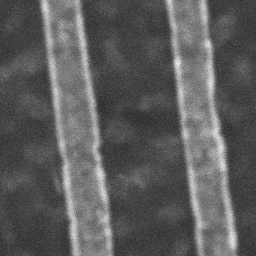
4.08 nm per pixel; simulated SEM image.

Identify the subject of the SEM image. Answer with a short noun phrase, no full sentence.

one or a few lines or trenches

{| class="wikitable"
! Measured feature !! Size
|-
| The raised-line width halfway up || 147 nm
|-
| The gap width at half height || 356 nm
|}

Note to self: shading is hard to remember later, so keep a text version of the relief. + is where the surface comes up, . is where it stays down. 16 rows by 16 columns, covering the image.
...++......++...
...++......++...
...++......++...
...++......++...
...++......++...
...+++.....++...
...+++.....++...
....++.....+++..
....++.....+++..
....++......++..
....++......++..
....++......++..
....+++.....++..
....+++.....++..
....+++.....+++.
.....++.....+++.